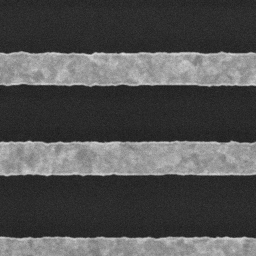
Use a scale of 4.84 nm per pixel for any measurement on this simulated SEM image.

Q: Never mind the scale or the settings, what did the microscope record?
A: lines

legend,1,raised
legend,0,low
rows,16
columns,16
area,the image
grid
0000000000000000
0000000000000000
0000000000000000
1111111111111111
1111111111111111
0000000000000000
0000000000000000
0000000000000000
0000000000000000
1111111111111111
1111111111111111
0000000000000000
0000000000000000
0000000000000000
0000000000000000
1111111111111111